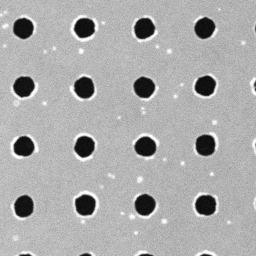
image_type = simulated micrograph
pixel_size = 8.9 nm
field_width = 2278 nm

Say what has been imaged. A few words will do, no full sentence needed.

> a regular array of holes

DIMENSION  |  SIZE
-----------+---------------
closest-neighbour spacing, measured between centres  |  0.52 µm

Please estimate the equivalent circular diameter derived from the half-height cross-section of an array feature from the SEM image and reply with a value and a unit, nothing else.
0.188 µm